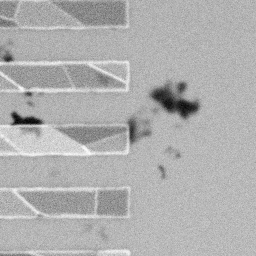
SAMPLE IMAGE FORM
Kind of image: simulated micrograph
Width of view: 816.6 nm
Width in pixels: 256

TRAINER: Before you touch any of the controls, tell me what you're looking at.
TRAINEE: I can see wiring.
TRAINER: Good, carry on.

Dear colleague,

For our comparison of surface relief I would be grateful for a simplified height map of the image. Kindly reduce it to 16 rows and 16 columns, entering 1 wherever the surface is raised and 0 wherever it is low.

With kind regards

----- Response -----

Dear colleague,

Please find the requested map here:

1111111100000000
1111111100000000
0000000000000000
0000000000000000
1111111000000000
1111111100000000
0000000000000000
0000000000000000
1111000000000000
1111100000000000
0000000000000000
0000000000000000
1111110000000000
1111110000000000
0000000000000000
0000000000000000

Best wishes